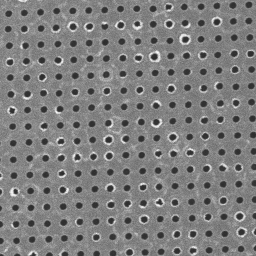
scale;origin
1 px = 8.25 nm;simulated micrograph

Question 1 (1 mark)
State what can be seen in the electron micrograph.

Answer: a regular array of holes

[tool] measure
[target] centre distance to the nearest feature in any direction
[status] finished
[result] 128 nm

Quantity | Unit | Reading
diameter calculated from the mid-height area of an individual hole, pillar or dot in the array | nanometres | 55.9